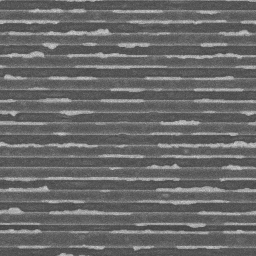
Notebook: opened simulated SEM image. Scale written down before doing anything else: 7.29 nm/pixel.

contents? parallel lines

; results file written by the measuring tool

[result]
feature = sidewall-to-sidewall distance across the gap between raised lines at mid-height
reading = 65.6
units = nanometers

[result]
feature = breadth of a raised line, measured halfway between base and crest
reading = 0.0983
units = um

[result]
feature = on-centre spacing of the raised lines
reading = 162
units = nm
